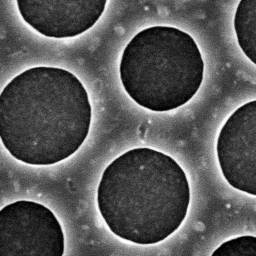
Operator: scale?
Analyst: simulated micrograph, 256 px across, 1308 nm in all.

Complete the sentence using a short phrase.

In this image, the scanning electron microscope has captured holes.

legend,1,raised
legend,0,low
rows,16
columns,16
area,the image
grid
1000000111111110
1100001111111110
1111111100001110
1111111100000110
1000111000000111
0000011100001111
0000001110011110
0000001111111100
0000011111111100
1000011100111100
1111111000011100
1111110000001100
1111110000001111
0001110000001111
0000111000011111
0000111111111100